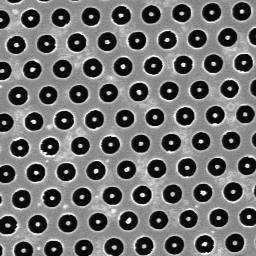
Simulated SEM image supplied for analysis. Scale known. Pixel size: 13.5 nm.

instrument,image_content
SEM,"a regular array of ring-shaped grooves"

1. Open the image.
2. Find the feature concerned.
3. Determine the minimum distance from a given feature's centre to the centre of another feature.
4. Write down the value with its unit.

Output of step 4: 0.399 um